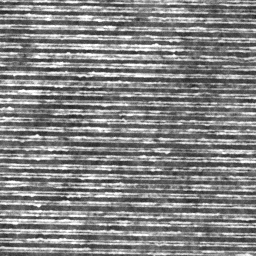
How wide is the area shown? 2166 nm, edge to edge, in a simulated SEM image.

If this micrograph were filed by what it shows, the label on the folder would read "parallel lines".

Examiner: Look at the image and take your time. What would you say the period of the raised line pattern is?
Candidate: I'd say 78.6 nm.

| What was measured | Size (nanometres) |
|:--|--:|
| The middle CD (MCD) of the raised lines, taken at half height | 35.9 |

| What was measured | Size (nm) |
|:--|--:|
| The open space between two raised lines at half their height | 42.3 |